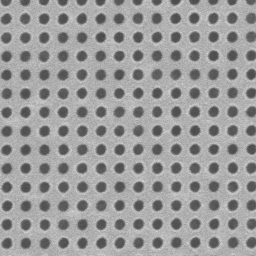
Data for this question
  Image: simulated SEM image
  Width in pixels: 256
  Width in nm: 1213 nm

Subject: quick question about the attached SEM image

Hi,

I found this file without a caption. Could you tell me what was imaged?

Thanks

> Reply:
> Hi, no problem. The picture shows a regular array of holes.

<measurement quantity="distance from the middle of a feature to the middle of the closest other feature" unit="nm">87.8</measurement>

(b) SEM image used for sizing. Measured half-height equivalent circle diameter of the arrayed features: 49.9 nanometers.